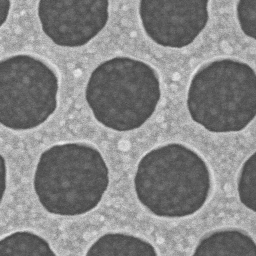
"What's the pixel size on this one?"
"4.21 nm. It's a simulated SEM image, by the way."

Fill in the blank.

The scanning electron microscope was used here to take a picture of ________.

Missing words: holes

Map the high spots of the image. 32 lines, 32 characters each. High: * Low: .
.****.........***.........****..
.****.........***.........****..
.****........*****........****..
*****........*****........****..
******......*******......******.
*******....*********....********
********************************
.....********....**********...**
......******.......******......*
.......****.........****........
.......****.........****........
.......****.........****........
.......****.........***.........
.......****........****.........
......******.......*****........
.....********.....*******......*
***************************.****
********************************
******......********....********
*****........*****.......******.
.****........****.........****..
.***..........***.........****..
.***..........***.........****..
.***.........****.........****..
*****........****.........****..
*****.......******.......*****..
******.....********.....********
********************************
********************************
*....********....********......*
......******.......******.......
.......****........*****........